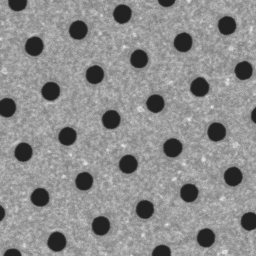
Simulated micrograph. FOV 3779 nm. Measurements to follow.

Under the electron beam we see a regular array of holes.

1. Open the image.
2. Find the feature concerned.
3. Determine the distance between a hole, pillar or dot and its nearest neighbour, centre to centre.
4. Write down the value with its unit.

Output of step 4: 46.9 px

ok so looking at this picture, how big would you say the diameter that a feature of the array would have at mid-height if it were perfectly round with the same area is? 0.285 microns